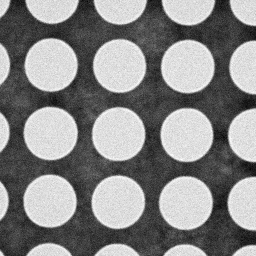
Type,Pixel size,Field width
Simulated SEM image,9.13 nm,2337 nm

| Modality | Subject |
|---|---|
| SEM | an array of small figures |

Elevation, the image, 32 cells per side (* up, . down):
*..*******..******..*******..***
*...*****...******...*****...***
.....***.....****.....***.....**
................................
................................
....****.....****.....***.....**
*...*****...******...*****...***
*..*******..******..*******..***
*..*******..******..*******..***
*..******...******..*******..***
....*****....****....*****...***
.......................*.......*
................................
.....**.......*.................
....*****....****....*****....**
*..******...******..******...***
*..*******..******..*******..***
*..*******..******..*******..***
....*****...******...*****...***
.....***.....****....****.....**
................................
................................
....****.....****.....***.....**
*..******...******...*****...***
*..******...******..******...***
*..******...******..******...***
*..******...******..******...***
....****....*****....*****...***
......................**.......*
................................
.....*..........................
....*****...*****....****.....**